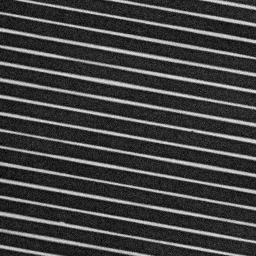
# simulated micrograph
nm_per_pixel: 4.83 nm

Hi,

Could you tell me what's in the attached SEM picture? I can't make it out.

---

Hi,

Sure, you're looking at parallel lines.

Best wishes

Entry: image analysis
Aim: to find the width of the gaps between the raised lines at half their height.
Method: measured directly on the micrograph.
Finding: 14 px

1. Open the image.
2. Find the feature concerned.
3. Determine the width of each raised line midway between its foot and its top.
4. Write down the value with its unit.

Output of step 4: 0.0136 um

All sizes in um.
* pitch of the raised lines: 0.0795